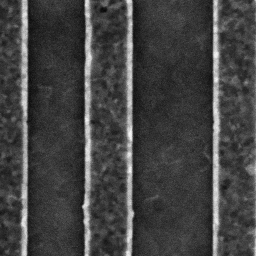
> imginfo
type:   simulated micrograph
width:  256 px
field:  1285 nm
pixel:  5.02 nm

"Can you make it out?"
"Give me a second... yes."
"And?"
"one or a few lines or trenches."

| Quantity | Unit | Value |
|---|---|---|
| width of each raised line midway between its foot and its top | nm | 216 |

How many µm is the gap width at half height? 0.368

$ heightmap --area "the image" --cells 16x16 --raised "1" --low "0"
1100001100000011
1100001100000011
1100001100000011
1100011100000111
1100011100000111
1100011100000111
1100011100000111
1100011100000111
1100011100000111
1100011100000111
1100011100000111
1100011100000111
1100011100000111
1100011100000111
1100011100000111
1100011100000111